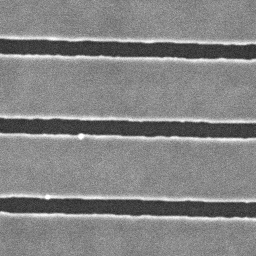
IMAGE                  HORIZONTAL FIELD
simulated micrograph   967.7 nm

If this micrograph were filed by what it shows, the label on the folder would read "lines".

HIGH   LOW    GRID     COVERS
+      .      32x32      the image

++++++++++++++++++++++++++++++++
++++++++++++++++++++++++++++++++
++++++++++++++++++++++++++++++++
++++++++++++++++++++++++++++++++
++++++++++++++++++++++++++++++++
...........................++++.
................................
++++++++++++++++++++++++++++++++
++++++++++++++++++++++++++++++++
++++++++++++++++++++++++++++++++
++++++++++++++++++++++++++++++++
++++++++++++++++++++++++++++++++
++++++++++++++++++++++++++++++++
++++++++++++++++++++++++++++++++
++++++++++++++++++++++++++++++++
................................
................................
++++++++++++++++++++++++++++++++
++++++++++++++++++++++++++++++++
++++++++++++++++++++++++++++++++
++++++++++++++++++++++++++++++++
++++++++++++++++++++++++++++++++
++++++++++++++++++++++++++++++++
++++++++++++++++++++++++++++++++
++++++++++++++++++++++++++++++++
................................
................................
++++++++++++++++++++++++++++++++
++++++++++++++++++++++++++++++++
++++++++++++++++++++++++++++++++
++++++++++++++++++++++++++++++++
++++++++++++++++++++++++++++++++